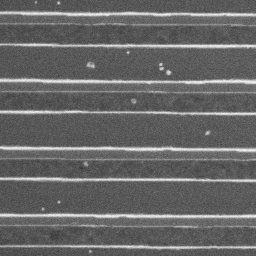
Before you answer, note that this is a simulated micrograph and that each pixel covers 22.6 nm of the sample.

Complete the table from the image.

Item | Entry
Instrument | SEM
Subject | lines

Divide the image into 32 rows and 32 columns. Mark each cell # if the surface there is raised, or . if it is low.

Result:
................................
................................
################################
################################
################################
......##########################
................................
................................
................................
................................
################################
################################
################################
################################
................................
................................
................................
................................
................................
################################
################################
################################
................................
................................
................................
................................
................................
################################
################################
################################
################################
................................